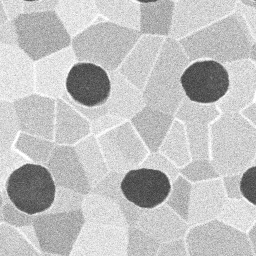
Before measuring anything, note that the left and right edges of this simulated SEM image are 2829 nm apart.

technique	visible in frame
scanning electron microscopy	holes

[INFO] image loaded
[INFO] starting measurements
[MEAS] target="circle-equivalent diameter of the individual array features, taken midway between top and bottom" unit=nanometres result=501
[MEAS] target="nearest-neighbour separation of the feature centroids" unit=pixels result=116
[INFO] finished